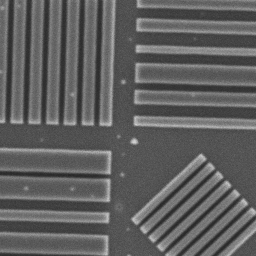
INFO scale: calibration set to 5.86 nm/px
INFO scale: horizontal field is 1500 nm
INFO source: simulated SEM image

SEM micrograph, groups of lines, slits or small figures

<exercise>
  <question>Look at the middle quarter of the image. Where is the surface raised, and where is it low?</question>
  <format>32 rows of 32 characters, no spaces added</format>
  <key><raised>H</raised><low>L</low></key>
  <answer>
LHHLLHHHLLHHLLLLLLHHHHHHHHHHHHHH
LHHLLHHHLLHHLLLLLLHHHHHHHHHHHHHH
HHHLLHHHLHHHLLLLLLHHHHHHHHHHHHHH
HHHLLHHHLHHHLLLLLLHHHHHHHHHHHHHH
HHHLLHHHLHHHLLLLLLHHHHHHHHHHHHHH
HHHLLHHHLHHHLLLLLLLLLLLLLLLLLLLL
HHHLLHHHLHHHLLLLLLLLLLLLLLLLLLLL
HHHLLHHHLHHHLLLLLLHHHHHHHHHHHHHH
HHHLLHHLLHHHLLLLLLHHHHHHHHHHHHHH
HHHLLHHLLHHHLLLLLLHHHHHHHHHHHHHH
HHHLLHHLLHHHLLLLLLLLLLLLLLLLLLLL
HHHLLHHLLHHHLLLLLLLLLLLLLLLLLLLL
HHHLLHHLLHHHLLLLLLLLLLLLLLLLLLLL
HHHLLHHLLHHHLLLLLLHHHHHHHHHHHHLL
HHHLLHHLLHHHLLLLLLHHHHHHHHHHHHHH
LLLLLLLLLLLLLLLLLLLLLLLLLLLLLLHH
LLLLLLLLLLLLLLLLLLLLLLLLLLLLLLLL
LLLLLLLLLLLLLLLLLLLLLLLLLLLLLLLL
LLLLLLLLLLLLLLLLLLLLLLLLLLLLLLLL
LLLLLLLLLLLLLLLLLLLLLLLLLLLLLLLL
LLLLLLLLLLLLLLLLLLLLLLLLLLLLLLLL
LLLLLLLLLLLLLLLLLLLLLLLLLLLLLLLL
HHHHHHHHHHHHLLLLLLLLLLLLLLLLLLLL
HHHHHHHHHHHHLLLLLLLLLLLLLLLLLLLL
HHHHHHHHHHHHLLLLLLLLLLLLLLLLLLLL
HHHHHHHHHHHLLLLLLLLLLLLLLLLLLLLH
HHHHHHHHHHHLLLLLLLLLLLLLLLLLLLHH
LLLLLLLLLLLLLLLLLLLLLLLLLLLLLHHH
LLLLLLLLLLLLLLLLLLLLLLLLLLLLHHHL
HHHHHHHHHHHLLLLLLLLLLLLLLLLHHHLH
HHHHHHHHHHHLLLLLLLLLLLLLLLHHHLHH
HHHHHHHHHHHLLLLLLLLLLLLLLHHLLHHH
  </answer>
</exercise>